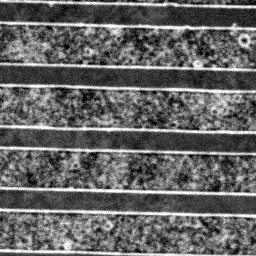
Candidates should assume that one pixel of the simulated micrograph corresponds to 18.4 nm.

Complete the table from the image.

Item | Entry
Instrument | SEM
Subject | one or a few lines or trenches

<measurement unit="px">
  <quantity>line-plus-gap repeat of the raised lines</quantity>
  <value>62.3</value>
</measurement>